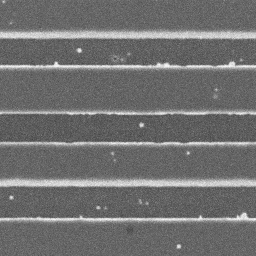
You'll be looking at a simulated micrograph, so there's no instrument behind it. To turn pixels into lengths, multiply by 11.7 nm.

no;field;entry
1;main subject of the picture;lines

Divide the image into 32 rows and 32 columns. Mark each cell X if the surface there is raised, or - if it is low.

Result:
XXXXXXXXXXXXXXXXXXXXXXXXXXXXXXXX
XXXXXXXXXXXXXXXXXXXXXXXXXXXXXXXX
XXXXXXXXXXXXXXXXXXXXXXXXXXXXXXXX
XXXXXXXXXXXXXXXXXXXXXXXXXXXXXXXX
-X-XXX-----------X---XX--X-X-XXX
--------------------------------
--------------------------------
--------------------------------
XXXXXXXXXXXXXXXXXXXXXXXXXXXXXXXX
XXXXXXXXXXXXXXXXXXXXXXXXXXXXXXXX
XXXXXXXXXXXXXXXXXXXXXXXXXXXXXXXX
XXXXXXXXXXXXXXXXXXXXXXXXXXXXXXXX
XXXXXXXXXXXXXXXXXXXXXXXXXXXXXXXX
XXXXXXXXXXXXXXXXXXXXXXXXXXXXXXXX
--------------------------------
--------------------------------
--------------------------------
--------------------------------
XXXXXXXXXXXXXXXXXXXXXXXXXXXXXXXX
XXXXXXXXXXXXXXXXXXXXXXXXXXXXXXXX
XXXXXXXXXXXXXXXXXXXXXXXXXXXXXXXX
XXXXXXXXXXXXXXXXXXXXXXXXXXXXXXXX
XXXXXXXXXXXXXXXXXXXXXXXXXXXXXXXX
--------------------------------
--------------------------------
--------------------------------
--------------------------------
XXXXXXXXXXXXXXXXXXXXXXXXXXXXXXXX
XXXXXXXXXXXXXXXXXXXXXXXXXXXXXXXX
XXXXXXXXXXXXXXXXXXXXXXXXXXXXXXXX
XXXXXXXXXXXXXXXXXXXXXXXXXXXXXXXX
XXXXXXXXXXXXXXXXXXXXXXXXXXXXXXXX